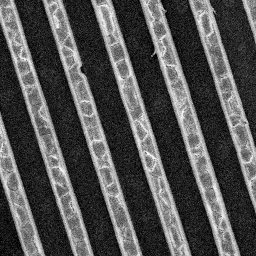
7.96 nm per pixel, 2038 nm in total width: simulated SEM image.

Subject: parallel lines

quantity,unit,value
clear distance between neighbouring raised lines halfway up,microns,0.231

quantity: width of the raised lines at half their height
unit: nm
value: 141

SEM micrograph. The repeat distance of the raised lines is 371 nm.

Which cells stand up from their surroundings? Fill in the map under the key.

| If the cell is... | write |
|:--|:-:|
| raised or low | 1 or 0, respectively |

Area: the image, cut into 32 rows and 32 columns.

11000011000011000011000011000001
11000011000011000011000011000001
11000011000011100011100011100001
11100001100001100001100001100000
01100001100001100001100001100000
01100001100001100001110001110000
01110001110000110000110000110000
00110000110000110000110000110000
00110000110000110000111000111000
00110000110000011000011000011000
00011000011000011000011000011000
00011000011000011000011100011100
00011100011100011100001100001100
00001100001100001100001100001100
00001100001100001100001100001110
00001100001110001110001110000110
10001110000110000110000110000110
10000110000110000110000110000110
10000110000111000111000111000111
11000111000011000011000011000011
11000011000011000011000011000011
11000011000011000011000011100011
11100011100011100001100001100001
01100001100001100001100001100001
01100001100001100001100001110001
01110001110001110000110000110000
00110000110000110000110000110000
00110000110000110000110000110000
00110000111000111000111000011000
00111000011000011000011000011000
00011000011000011000011000011000
00011000011100011100011100011100